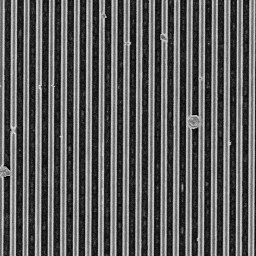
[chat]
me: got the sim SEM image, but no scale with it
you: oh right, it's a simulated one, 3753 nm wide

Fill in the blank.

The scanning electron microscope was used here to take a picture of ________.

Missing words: parallel lines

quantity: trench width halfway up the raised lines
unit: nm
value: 123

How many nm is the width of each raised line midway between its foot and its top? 67.8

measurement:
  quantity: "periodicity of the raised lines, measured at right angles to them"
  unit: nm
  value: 184